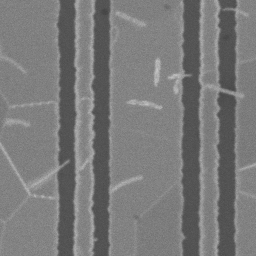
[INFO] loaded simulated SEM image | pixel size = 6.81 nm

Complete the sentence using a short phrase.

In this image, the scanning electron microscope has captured lines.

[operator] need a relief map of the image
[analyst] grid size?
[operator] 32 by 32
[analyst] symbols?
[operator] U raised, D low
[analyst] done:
UUUUUUUDDUUUDDUUUUUUUUUDDUUDDDUU
UUUUUUUDDUUUDDUUUUUUUUUDDUUDDUUU
UUUUUUUDDUUUDDUUUUUUUUUDDUUDDUUU
UUUUUUUDDUUUDDUUUUUUUUUDDUUDDUUU
UUUUUUUDDUUUDDUUUUUUUUUDDUUDDDUU
UUUUUUUDDUUUDDUUUUUUUUUDDUUDDUUU
UUUUUUUDDUUUDDUUUUUUUUUDDUUDDUUU
UUUUUUUDDUUUDDUUUUUUUUUDDUUDDDUU
UUUUUUUDDUUUDDUUUUUUUUUDDUUDDUUU
UUUUUUUDDUUUDDUUUUUUUUUDDUUDDUUU
UUUUUUUDDUUDDDUUUUUUUUUDDUUDDUUU
UUUUUUUDDUUUDDUUUUUUUUUDDUUUDUUU
UUUUUUUDDUUUDDUUUUUUUUUDDUUDDUUU
UUUUUUUDDUUUDDUUUUUUUUUDDUUDDUUU
UUUUUUUDDDUUDDUUUUUUUUUDDUUDDUUU
UUUUUUUDDUUUDDUUUUUUUUUDDUUDDUUU
UUUUUUUDDUUUDDUUUUUUUUUDDUUDDUUU
UUUUUUUDDUUUDDUUUUUUUUUDDUUDDUUU
UUUUUUUDDUUUDDUUUUUUUUUDDUUDDUUU
UUUUUUUDDUUUDDUUUUUUUUUDDUUDDUUU
UUUUUUUDDUUUDDUUUUUUUUUDDUUDDUUU
UUUUUUUDDUUUDDUUUUUUUUUDDUUDDUUU
UUUUUUUDDDUUDDUUUUUUUUUDDUUDDUUU
UUUUUUUDDUUUDDUUUUUUUUUDDUUDDUUU
UUUUUUUDDUUUDDUUUUUUUUUDDUUDDUUU
UUUUUUUDDUUUDDUUUUUUUUUDDUUDDUUU
UUUUUUUDDUUUDDUUUUUUUUUDDUUDDUUU
UUUUUUUDDUUUDDUUUUUUUUUDDUUDDUUU
UUUUUUUDDUUUDDUUUUUUUUUDDUUDDUUU
UUUUUUUDDUUUDDUUUUUUUUUDDUUDDUUU
UUUUUUUDDUUUDDUUUUUUUUUDDUUDDUUU
UUUUUUUDDUUUDDUUUUUUUUUDDUUDDUUU